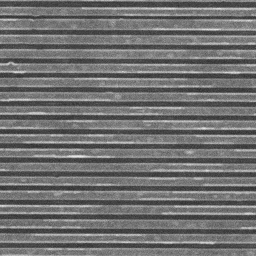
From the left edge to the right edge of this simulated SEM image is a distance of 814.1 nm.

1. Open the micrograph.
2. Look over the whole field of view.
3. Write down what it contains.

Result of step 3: parallel lines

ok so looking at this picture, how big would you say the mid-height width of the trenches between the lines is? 17.1 nm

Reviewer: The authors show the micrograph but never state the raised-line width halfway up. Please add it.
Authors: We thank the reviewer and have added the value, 28.3 nm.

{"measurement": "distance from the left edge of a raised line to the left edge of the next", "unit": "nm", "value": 45.2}